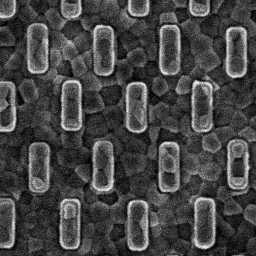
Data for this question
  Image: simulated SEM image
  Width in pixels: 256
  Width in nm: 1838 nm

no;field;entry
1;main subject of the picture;a regular array of raised bodies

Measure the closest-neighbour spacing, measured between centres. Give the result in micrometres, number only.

0.463